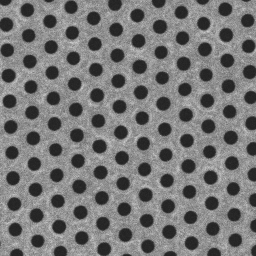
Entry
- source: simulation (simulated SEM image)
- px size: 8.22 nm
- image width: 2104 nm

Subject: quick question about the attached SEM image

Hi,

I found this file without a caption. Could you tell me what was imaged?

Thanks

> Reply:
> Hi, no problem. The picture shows a regular array of holes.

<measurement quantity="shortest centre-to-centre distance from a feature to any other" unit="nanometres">206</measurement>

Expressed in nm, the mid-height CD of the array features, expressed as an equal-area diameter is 110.